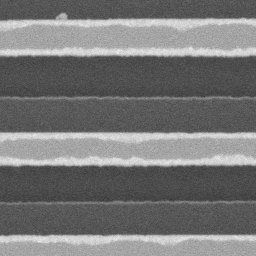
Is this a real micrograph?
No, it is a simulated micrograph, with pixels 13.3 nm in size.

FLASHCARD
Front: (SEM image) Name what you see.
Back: lines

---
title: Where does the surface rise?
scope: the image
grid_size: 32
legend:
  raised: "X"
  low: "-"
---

--------------------------------
--------------------------------
-------------XXXXXXXXXXXXXXXXXXX
XXXXXXXXXXXXXXXXXXXXXXXXXXXXXXXX
XXXXXXXXXXXXXXXXXXXXXXXXXXXXXXXX
XXXXXXXXXXXXXXXXXXXXXXXXXXXXXXXX
XXXXXXXXXXXXXXXXXXXXXXXXXXXXXXXX
--------------------------------
--------------------------------
--------------------------------
--------------------------------
--------------------------------
--------------------------------
--------------------------------
--------------------------------
--------------------------------
--------------------------------
XXXXXXXXXXXXXXXXXXXXXXXXXXXXXXXX
XXXXXXXXXXXXXXXXXXXXXXXXXXXXXXXX
XXXXXXXXXXXXXXXXXXXXXXXXXXXXXXXX
XXXXXXXXXXXXXXXXXXXXXXXXXXXXXXXX
--------------------------------
--------------------------------
--------------------------------
--------------------------------
--------------------------------
--------------------------------
--------------------------------
--------------------------------
-XXXX-XXXXX-XXXXXXXXXXXXXXXXXXXX
XXXXXXXXXXXXXXXXXXXXXXXXXXXXXXXX
XXXXXXXXXXXXXXXXXXXXXXXXXXXXXXXX